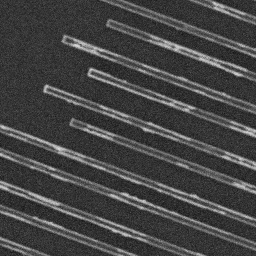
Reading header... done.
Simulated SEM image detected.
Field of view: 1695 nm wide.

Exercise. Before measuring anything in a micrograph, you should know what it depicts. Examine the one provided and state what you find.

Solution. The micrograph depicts parallel lines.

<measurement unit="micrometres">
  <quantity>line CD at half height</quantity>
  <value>0.0443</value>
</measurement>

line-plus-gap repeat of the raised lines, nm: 174